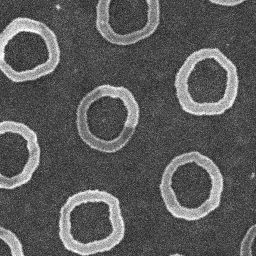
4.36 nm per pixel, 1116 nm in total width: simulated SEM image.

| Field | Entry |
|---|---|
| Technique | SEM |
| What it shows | ring-shaped raised bodies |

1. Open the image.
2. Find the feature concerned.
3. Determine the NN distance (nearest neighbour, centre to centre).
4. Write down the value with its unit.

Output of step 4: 452 nm